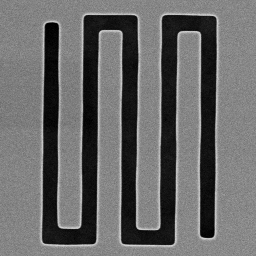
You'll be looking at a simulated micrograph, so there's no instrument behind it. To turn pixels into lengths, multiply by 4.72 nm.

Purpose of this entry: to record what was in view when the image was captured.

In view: groups of lines, slits or small figures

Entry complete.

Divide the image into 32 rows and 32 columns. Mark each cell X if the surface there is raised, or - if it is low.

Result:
XXXXXXXXXXXXXXXXXXXXXXXXXXXXXXXX
XXXXXXXXXXXXXXXXXXXXXXXXXXXXXXXX
XXXXXXXXXXX------XXX-------XXXXX
XXXXXX-XXX-------XXX-------XXXXX
XXXXXX-XXX--XXX--XXX--XXX--XXXXX
XXXXX--XXX--XXX--XXX--XXX--XXXXX
XXXXX--XXX--XXX--XXX--XXX--XXXXX
XXXXX--XXX--XXX--XXX--XXX--XXXXX
XXXXX--XXX--XXX--XXX--XXX--XXXXX
XXXXX--XXX--XXX--XXX--XXX--XXXXX
XXXXX--XXX--XXX--XXX--XXX--XXXXX
XXXXX--XXX--XXX--XXX--XXX--XXXXX
XXXXX--XXX--XXX--XXX--XXX--XXXXX
XXXXX--XXX--XXX--XXX--XXX--XXXXX
XXXXX--XXX--XXX--XXX--XXX--XXXXX
XXXXX--XXX--XXX--XXX--XXX--XXXXX
XXXXX--XXX--XXX--XXX--XXX--XXXXX
XXXXX--XXX--XXX--XXX--XXX--XXXXX
XXXXX--XXX--XXX--XXX--XXX--XXXXX
XXXXX--XXX--XXX--XXX--XXX--XXXXX
XXXXX--XXX--XXX--XXX--XXX--XXXXX
XXXXX--XXX--XXX--XXX--XXX--XXXXX
XXXXX--XXX--XXX--XXX--XXX--XXXXX
XXXXX--XXX--XXX--XXX--XXX--XXXXX
XXXXX--XXX--XXX--XXX--XXX--XXXXX
XXXXX--XXX--XXX--XXX--XXX--XXXXX
XXXXX--XXX--XXX--XXX--XXX--XXXXX
XXXXX--XXX--XXX--XXX--XXX--XXXXX
XXXXX---XX--XXX--XXX--XXX--XXXXX
XXXXX-------XXX-------XXX--XXXXX
XXXXXX-----XXXXX-----XXXXXXXXXXX
XXXXXXXXXXXXXXXXXXXXXXXXXXXXXXXX